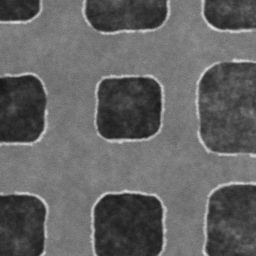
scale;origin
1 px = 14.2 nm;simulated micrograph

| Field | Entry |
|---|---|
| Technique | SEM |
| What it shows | holes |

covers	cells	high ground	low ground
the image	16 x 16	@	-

--@@@-----@@@---
@@@@@@----@@@---
@@@@@@@@@@@@@@@@
@@@@@@@@@@@@@@@@
@@@@@@@@@@@@@---
---@@@----@@----
---@@@----@@----
---@@@----@@----
--@@@@---@@@@---
@@@@@@@@@@@@@---
@@@@@@@@@@@@@@@@
@@@@@@@@@@@@@@@@
--@@@@----@@@---
---@@@----@@@---
---@@@----@@@---
---@@@----@@@---